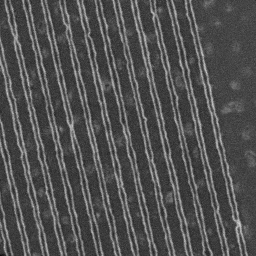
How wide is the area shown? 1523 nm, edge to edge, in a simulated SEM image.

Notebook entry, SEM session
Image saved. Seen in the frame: parallel lines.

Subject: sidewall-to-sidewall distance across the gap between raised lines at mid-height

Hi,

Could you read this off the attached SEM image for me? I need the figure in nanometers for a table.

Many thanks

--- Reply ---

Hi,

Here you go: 73.3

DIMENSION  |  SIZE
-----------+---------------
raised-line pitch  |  105 nm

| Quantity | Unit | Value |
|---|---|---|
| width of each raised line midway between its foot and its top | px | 5.24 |